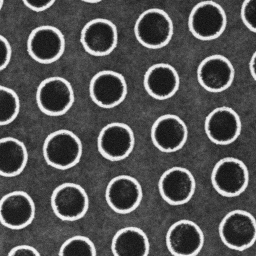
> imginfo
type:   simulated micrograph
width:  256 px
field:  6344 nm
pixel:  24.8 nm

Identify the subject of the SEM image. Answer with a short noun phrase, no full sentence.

a regular array of raised bodies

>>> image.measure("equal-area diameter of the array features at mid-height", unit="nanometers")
848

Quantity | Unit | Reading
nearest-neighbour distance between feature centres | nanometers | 1310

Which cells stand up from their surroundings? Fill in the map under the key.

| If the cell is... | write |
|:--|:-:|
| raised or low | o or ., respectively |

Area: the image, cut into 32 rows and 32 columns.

...ooo...................oo....o
..................oo....oooo..oo
.................oooo...oooo...o
...........ooo...oooo...oooo....
....oooo..oooo...oooo....oo.....
o...oooo...ooo....oo............
o...oooo...ooo..................
o....oo...................oo....
...................oo....oooo..o
............ooo...oooo...oooo...
.....ooo....oooo..oooo...oooo...
o....oooo..ooooo...ooo..........
oo...oooo...ooo.................
oo...ooo........................
oo........................ooo...
....................ooo...oooo..
.......o.....ooo...oooo...oooo..
.o....oooo..ooooo..oooo....oo...
ooo...oooo...ooo....oo..........
ooo...oooo...ooo................
ooo...ooo..................ooo..
oo...................oo....oooo.
..............ooo...oooo...oooo.
........oo....ooo...oooo...ooo..
.oo....oooo..oooo....ooo........
oooo...oooo...ooo...............
oooo...ooo......................
oooo........................oooo
......................ooo...oooo
...............ooo...oooo...oooo
........ooo...oooo...oooo...ooo.
..oo....oooo..oooo....ooo.......